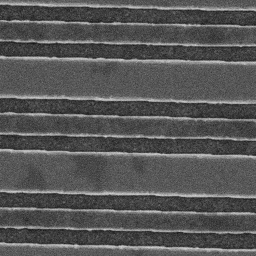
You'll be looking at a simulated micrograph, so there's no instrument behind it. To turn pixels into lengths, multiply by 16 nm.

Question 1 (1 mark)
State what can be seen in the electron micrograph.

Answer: lines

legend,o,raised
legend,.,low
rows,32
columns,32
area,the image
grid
..oooooooooooooooooooooooooooooo
................................
................................
oooooooooooooooooooooooooooooooo
oooooooooooooooooooooooooooooooo
...................ooooooooooooo
................................
oooooooooooooooo................
oooooooooooooooooooooooooooooooo
oooooooooooooooooooooooooooooooo
oooooooooooooooooooooooooooooooo
oooooooooooooooooooooooooooooooo
............oooooooooooooooooooo
................................
oooooooooooooo..................
oooooooooooooooooooooooooooooooo
oooooooooooooooooooooooooooooooo
................................
................................
ooooooooooooooooooooooooooooooo.
oooooooooooooooooooooooooooooooo
oooooooooooooooooooooooooooooooo
oooooooooooooooooooooooooooooooo
oooooooooooooooooooooooooooooooo
.......................ooooooooo
................................
oooooooooooooooooooo............
oooooooooooooooooooooooooooooooo
..oooooooooooooooooooooooooooooo
................................
ooooo...........................
oooooooooooooooooooooooooooooooo